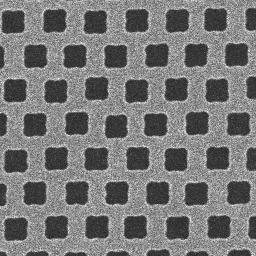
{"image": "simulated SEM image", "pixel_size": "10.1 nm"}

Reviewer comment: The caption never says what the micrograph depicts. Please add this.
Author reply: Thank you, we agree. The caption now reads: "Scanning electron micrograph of a regular array of holes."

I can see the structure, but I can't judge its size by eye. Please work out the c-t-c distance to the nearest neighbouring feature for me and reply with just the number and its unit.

392 nanometres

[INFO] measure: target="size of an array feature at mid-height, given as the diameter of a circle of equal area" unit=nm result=256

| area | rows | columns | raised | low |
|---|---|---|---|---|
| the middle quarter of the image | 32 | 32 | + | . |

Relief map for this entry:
.....+++++.....++++++.....++++..
++++++++++++++++++++++++++++++++
++++++++++++++++++++++++++++++++
++++++.....+++++++++++++++.++.++
.++++......+++++.....++++......+
.++++......++++......++++......+
.++++......++++......++++......+
.++++......++++......++++......+
.++++......++++......++++......+
++++++++++++++++....++++++++++++
++++++++++++++++++++++++++++++++
++++++++++++++++++++++++++++++++
+.....++++++++.+++++.....++++++.
......++++......++++......++++..
......++++......++++......++++..
......++++......++++......++++..
......++++......++++......++++..
+....+++++......++++......+++++.
+++++++++++....+++++++++++++++++
++++++++++++++++++++++++++++++++
++++++++++++++++++++++++++++++++
.++++......+++++.....++++......+
.++++......++++......++++......+
.++++......+++++.....++++......+
.++++......+++++.....++++......+
.++++......+++++.....++++......+
+++++.....+++++++.+.+++++.....++
++++++++++++++++++++++++++++++++
++++++++++++++++++++++++++++++++
++...+++++++....+++++.....++++++
......++++......+++++.....++++..
......++++......+++++.....++++..